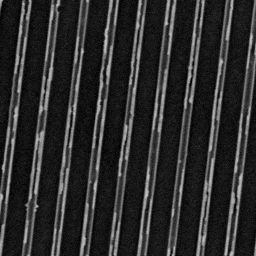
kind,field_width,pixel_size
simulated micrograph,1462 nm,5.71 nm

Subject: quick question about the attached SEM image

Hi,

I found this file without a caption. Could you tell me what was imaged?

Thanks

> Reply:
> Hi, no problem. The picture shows parallel lines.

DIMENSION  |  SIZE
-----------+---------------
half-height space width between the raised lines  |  0.117 micrometres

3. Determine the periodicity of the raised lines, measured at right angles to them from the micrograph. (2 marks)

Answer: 164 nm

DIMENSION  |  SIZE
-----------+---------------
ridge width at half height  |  7.93 pixels